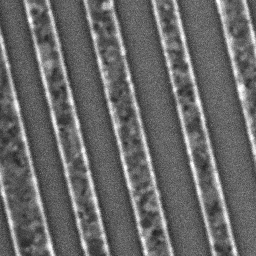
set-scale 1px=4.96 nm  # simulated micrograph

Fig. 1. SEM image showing one or a few lines or trenches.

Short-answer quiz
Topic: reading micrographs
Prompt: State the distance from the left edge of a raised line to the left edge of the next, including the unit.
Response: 308 nm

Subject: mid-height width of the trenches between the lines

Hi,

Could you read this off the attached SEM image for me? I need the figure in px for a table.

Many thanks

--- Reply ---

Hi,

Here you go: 36.9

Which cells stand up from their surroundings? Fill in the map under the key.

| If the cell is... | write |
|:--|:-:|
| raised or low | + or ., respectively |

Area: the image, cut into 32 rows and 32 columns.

...+++.....+++.....+++.....++++.
....++.....+++.....+++......+++.
....++.....+++......++......+++.
....+++....++++.....+++.....+++.
....+++.....+++.....+++.....++++
....+++.....+++.....+++......+++
+....+++....+++......++......+++
+....+++....++++.....+++.....+++
+....+++.....+++.....+++.....+++
+....+++.....+++.....+++......++
++....++.....+++......++......++
++....+++....++++.....++......++
++....+++.....+++.....+++.....++
++....+++.....+++.....+++......+
++.....++.....+++......++......+
+++....+++....+++......+++.....+
+++....+++.....+++.....+++.....+
+++....+++.....+++.....+++.....+
+++.....++.....+++......++......
++++....+++....+++......++......
++++....+++.....+++.....+++.....
++++....+++.....+++.....+++.....
++++.....++.....+++......++.....
++++.....++.....+++......++.....
+++++....+++....++++.....+++....
.++++....+++.....+++.....+++....
.++++....+++.....+++.....+++....
.+++++....++.....+++......++....
.+++++....+++....++++.....+++...
..++++....+++.....+++.....+++...
..++++....+++.....+++.....+++...
..+++++....++.....+++......++...